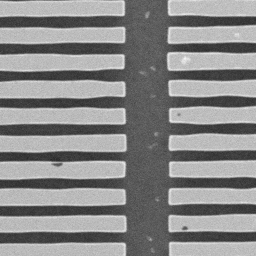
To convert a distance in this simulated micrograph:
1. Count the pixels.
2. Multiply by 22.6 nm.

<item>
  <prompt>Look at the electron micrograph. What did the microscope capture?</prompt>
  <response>groups of lines, slits or small figures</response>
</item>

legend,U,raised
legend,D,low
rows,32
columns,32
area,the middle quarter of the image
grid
UUUUUUUUUUUUUUUDDDDDDDDDDDUUUUUU
DDDDDDDDDDDDDDDDDDDDDDDDDDDDDDDD
DDDDDDDDDDDDDDDDDDDDDDDDDDDDDDDD
DDDDDDDDDDDDDDDDDDDDDDDDDDDDDDDD
DUUUUUUUUDDDDDDDDDDDDDDDDDDUUUUU
UUUUUUUUUUUUUUUDDDDDDDDDDDUUUUUU
UUUUUUUUUUUUUUUDDDDDDDDDDDUUUUUU
UUUUUUUUUUUUUUUDDDDDDDDDDDDUUUUU
DDDDDDDDDDDDDDDDDDDDDDDDDDDDDDDD
DDDDDDDDDDDDDDDDDDDDDDDDDDDDDDDD
DDDDDDDDDDDDDDDDDDDDDDDDDDDDDDDD
UUUUUUUUUUUUUUUDDDDDDDDDDDDUUUUU
UUUUUUUUUUUUUUUDDDDDDDDDDDDUUUUU
UUUUUUUUUUUUUUUDDDDDDDDDDDDUUUUU
UUUUUUUUUUUUUUUDDDDDDDDDDDDDDDUU
DDDDDDDDDDDDDDDDDDDDDDDDDDDDDDDD
DDDDDDDDDDDDDDDDDDDDDDDDDDDDDDDD
DDDDDDDDDDDDDDDDDDDDDDDDDDDDDDDD
UUUUUUUUUUUUUUUDDDDDDDDDDDDUUUUU
UUUUUUUUUUUUUUUDDDDDDDDDDDDUUUUU
UUUUUUUUUUUUUUUDDDDDDDDDDDUUUUUU
UUUUUUUUUUUUUUUDDDDDDDDDDDDDDDDD
DDDDDDDDDDDDDDDDDDDDDDDDDDDDDDDD
DDDDDDDDDDDDDDDDDDDDDDDDDDDDDDDD
DDDUUUUUUUUUUUUDDDDDDDDDDDDDDDDD
UUUUUUUUUUUUUUUDDDDDDDDDDDDUUUUU
UUUUUUUUUUUUUUUDDDDDDDDDDDDUUUUU
UUUUUUUUUUUUUUUDDDDDDDDDDDDUUUUU
UUUUUUUUUUDDDDDDDDDDDDDDDDDDDDDD
DDDDDDDDDDDDDDDDDDDDDDDDDDDDDDDD
DDDDDDDDDDDDDDDDDDDDDDDDDDDDDDDD
UUUUUUUUUUUUUUUDDDDDDDDDDDDUUUUU